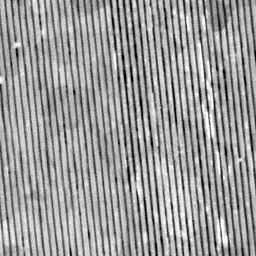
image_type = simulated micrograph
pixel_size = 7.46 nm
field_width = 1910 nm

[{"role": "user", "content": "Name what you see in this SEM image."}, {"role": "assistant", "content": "parallel lines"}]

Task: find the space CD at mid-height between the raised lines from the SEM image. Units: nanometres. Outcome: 13.9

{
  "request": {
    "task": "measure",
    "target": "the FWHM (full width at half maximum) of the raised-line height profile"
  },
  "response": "4.73 pixels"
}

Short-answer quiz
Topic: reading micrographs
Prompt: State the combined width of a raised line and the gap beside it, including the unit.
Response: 49.1 nm